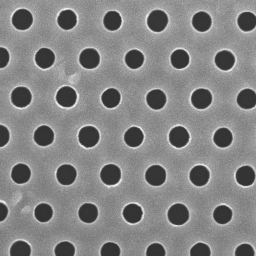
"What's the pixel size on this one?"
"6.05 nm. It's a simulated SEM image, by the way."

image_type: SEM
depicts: a regular array of holes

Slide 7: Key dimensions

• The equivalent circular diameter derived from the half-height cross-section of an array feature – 122 nm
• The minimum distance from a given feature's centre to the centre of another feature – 0.267 µm